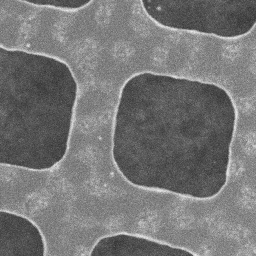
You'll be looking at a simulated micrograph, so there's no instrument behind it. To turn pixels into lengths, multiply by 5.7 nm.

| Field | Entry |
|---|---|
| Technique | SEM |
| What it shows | holes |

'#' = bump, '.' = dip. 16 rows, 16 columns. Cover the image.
####.####.......
##########......
################
...#############
....############
.....###......##
.....##........#
.....##........#
....###........#
....###.......##
##.####.......##
########......##
################
.###############
..##############
...###.....#####